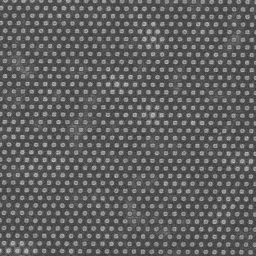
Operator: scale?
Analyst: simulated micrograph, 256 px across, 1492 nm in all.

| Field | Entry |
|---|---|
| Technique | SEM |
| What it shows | a regular array of raised bodies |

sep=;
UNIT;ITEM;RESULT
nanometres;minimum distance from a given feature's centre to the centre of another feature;49.9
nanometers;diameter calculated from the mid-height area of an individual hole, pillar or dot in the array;24.6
